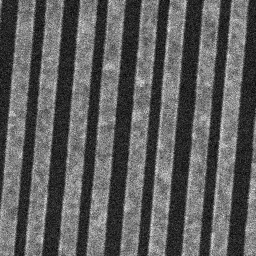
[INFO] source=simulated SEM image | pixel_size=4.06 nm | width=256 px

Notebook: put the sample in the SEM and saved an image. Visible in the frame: parallel lines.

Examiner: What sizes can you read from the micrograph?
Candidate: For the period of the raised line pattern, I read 123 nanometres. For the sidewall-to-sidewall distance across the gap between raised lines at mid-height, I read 13.1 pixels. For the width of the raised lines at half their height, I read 64.2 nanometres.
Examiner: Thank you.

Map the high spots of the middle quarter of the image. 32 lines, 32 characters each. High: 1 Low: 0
00011110001111000011110001111000
00011110001111000011110001111000
00011110001111000011110001111000
00011110001111000011110001111000
00011100001110000011110001111000
00011100001110000011110001111000
00111100011110000011110001110000
00111100011110000011110001110000
00111100011110000011100001110000
00111100011110000011100001110000
00111100011110000011100001110000
00111100011110000111100011110000
00111100011110000111100011110000
00111100011110000111100011110000
00111100011110000111100011110000
00111000011100000111100011110000
00111000011100000111100011110000
00111000011100000111000011100000
01111000111100000111000011100000
01111000111100000111000011100000
01111000111100000111000011100000
01111000111100000111000011100000
01111000111100000111000011100000
01111000111100001111000111100000
01111000111100001111000111100000
01111000111100001111000111100000
01111000111100001111000111100000
01110000111000001111000111100001
01110000111000001111000111100001
11110001111000001111000111000001
11110001111000001111000111000001
11110001111000001110000111000001